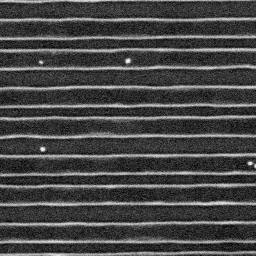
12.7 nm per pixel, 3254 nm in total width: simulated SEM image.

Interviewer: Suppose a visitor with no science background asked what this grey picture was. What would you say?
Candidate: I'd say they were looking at wiring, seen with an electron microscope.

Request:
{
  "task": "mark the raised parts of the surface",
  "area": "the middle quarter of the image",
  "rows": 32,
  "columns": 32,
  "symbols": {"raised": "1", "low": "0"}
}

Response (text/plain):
11111111111111111111111111111111
00000000000000000000000000000000
00000000000000000000000000000000
00000000000000000000000000000000
00000000000000000000000000000000
00000000000000000000000000000000
11111111111111111111111111111111
11111111111111111111111111111111
11111111111111111111111111111111
11111111111111111111111111111111
11111110000000111110000000000000
00000000000000000000000000000000
00000000000000000000000000000000
11000011100000011000001111111111
11111111111111111111111111111111
11111111111111111111111111111111
11111111111111111111111111111111
11111111111111111111111111111111
00000000000000000000000000000000
00000000000000000000000000000000
00000000000000000000000000000000
00000000000000000000000000000000
00000000000000000000000000000000
11111111111111111111111111111111
11111111111111111111111111111111
11111111111111111111111111111111
11111111111111111111111111111111
11111111101111111111100000000000
00000000000000000000000000000000
00000000000000000000000000000000
00000000000000000000000000000000
11111111111111111111111111111111